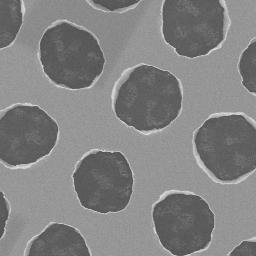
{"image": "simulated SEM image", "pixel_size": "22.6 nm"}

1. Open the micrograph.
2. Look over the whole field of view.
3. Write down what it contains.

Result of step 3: holes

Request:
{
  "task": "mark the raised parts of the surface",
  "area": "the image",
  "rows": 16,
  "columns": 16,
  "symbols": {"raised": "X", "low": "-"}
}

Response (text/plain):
-XXXXX--XX----XX
-XXXXXXXXX----XX
-XX---XXXX----XX
XXX---XXXXXXXXX-
XXX---XX--XXXXX-
XXXX-XX----XXXX-
XXXXXXX----XXXXX
---XXXXX---XX---
----XXXXXXXX----
---XXX-XXXXX----
XXXXX---XXXXX---
XXXXX---XXXXXXXX
XXXXX---XX---XXX
XXXXXXXXXX---XXX
XXX--XXXXX---XXX
XX---XXXXX---XX-